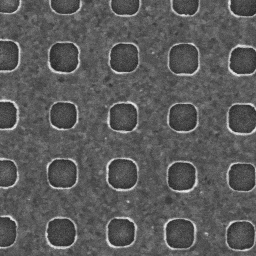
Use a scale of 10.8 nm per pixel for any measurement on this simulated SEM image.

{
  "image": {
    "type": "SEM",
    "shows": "a regular array of holes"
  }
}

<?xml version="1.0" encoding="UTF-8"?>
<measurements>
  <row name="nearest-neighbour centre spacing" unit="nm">629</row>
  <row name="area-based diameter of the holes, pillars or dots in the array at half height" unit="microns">0.328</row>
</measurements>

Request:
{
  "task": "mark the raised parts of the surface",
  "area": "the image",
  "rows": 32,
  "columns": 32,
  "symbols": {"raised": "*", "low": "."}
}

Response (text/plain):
..****....****...*****...****...
..*****..*****...*****...****...
********************************
********************************
********************************
..*****..******.*******.********
..****....****...****....****...
..****....****...****....****...
..****....****...****....****...
********************************
********************************
********************************
********************************
..****...*****...****...*****...
..****....****...****....****...
..*****..*****...****....***....
*****************************..*
********************************
********************************
********************************
..****...*****...*****..*****..*
..****....****...****....****...
..****....****...****...****....
*******.******..*****...*****...
********************************
********************************
********************************
.******..*****..******.*********
..****...****....****...****....
..****...****....****...****....
..****...*****..*****...****....
********************************